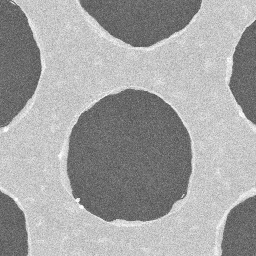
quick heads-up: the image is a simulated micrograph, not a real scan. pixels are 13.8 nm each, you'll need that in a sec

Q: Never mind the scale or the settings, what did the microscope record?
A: holes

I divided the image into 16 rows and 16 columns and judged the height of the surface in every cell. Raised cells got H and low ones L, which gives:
LHHHHLLLLLLLHHHH
LLHHHHLLLLLLHHHH
LLHHHHHLLLHHHHHL
LLLHHHHHHHHHHHHL
LLLHHHHHHHHHHHLL
LLHHHHHHLHHHHHLL
LLHHHHLLLLHHHHHL
LHHHHLLLLLLHHHHH
HHHHLLLLLLLLHHHH
HHHHLLLLLLLLHHHH
HHHHLLLLLLLLHHHH
HHHHLLLLLLLLHHHH
LHHHHLLLLLLLHHHL
LLHHHHLLLLHHHHLL
LLHHHHHHHHHHHHLL
LLHHHHHHHHHHHHLL